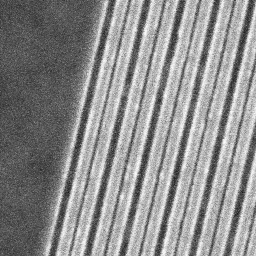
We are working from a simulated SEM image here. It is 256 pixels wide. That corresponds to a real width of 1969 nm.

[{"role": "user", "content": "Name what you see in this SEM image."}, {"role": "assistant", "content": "parallel lines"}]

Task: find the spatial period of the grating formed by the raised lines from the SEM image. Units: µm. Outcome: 0.13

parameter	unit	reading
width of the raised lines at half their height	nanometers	81.4